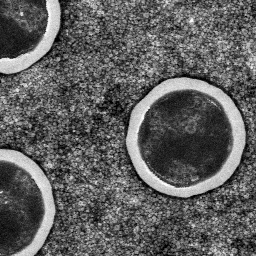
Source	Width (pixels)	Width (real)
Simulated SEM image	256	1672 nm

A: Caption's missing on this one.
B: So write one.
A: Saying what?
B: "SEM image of raised bodies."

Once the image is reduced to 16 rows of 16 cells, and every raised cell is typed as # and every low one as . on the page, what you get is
###.............
###.............
###.............
##..............
................
..........###...
.........#####..
.........######.
........#######.
........#######.
##.......#####..
###.......###...
###.............
###.............
###.............
##..............